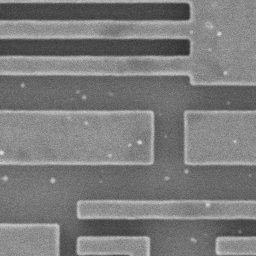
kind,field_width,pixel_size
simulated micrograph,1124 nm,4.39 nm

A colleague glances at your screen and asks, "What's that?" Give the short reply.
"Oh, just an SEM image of wiring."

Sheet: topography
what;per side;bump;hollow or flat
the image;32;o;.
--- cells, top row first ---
.......................ooooooooo
........................oooooooo
.......................ooooooooo
oooooooooooooooooooooooooooooooo
oooooooooooooooooooooooooooooooo
........................oooooooo
........................oooooooo
oooooooooooooooooooooooooooooooo
oooooooooooooooooooooooooooooooo
.......................ooooooooo
........................oooooooo
................................
................................
................................
ooooooooooooooooooo....ooooooooo
ooooooooooooooooooo....ooooooooo
ooooooooooooooooooo....ooooooooo
ooooooooooooooooooo....ooooooooo
ooooooooooooooooooo....ooooooooo
ooooooooooooooooooo....ooooooooo
ooooooooooooooooooo....ooooooooo
................................
................................
................................
................................
..........oooooooooooooooooooooo
..........oooooooooooooooooooooo
................................
ooooooo.........................
ooooooo.........................
ooooooo...ooooooooo........ooooo
ooooooo...ooooooooo........ooooo